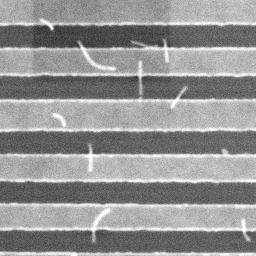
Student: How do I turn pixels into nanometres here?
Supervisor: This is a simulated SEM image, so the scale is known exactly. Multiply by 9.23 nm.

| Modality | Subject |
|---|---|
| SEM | lines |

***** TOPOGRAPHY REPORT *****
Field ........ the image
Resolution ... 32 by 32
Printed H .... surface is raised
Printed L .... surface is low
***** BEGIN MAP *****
HHHHHHHHHHHHHHHHHHHHHHHHHHHHHHHH
HHHHHHHHHHHHHHHHHHHHHHHHHHHHHHHH
HHHHHHHHHHHHHHHHHHHHHHHHHHHHHHHH
LLLLLLLLLLLLLLLLLLLLLLLLLLLLLLLL
LLLLLLLLLLLLLLLLLLLLLLLLLLLLLLLL
LLLLLLLLLLLLLLLLLLLLLLLLLLLLLLLL
HHHHHHHHHHHHHHHHHHHHHHHHHHHHHHHH
HHHHHHHHHHHHHHHHHHHHHHHHHHHHHHHH
HHHHHHHHHHHHHHHHHHHHHHHHHHHHHHHH
LLHHLLLLLLLLLLLLLHLLLLLLLLHLLHLL
LLLLLLLLLLLLLLLLLLLLLLLLLLLLLLLL
LLLLLLLLLLLLLLLLLLLLLLLLLLLLLLLL
LLLLLLLLLLLLLLLLLLLLLLHLLLLLLLLL
HHHHHHHHHHHHHHHHHHHHHHHHHHHHHHHH
HHHHHHHHHHHHHHHHHHHHHHHHHHHHHHHH
HHHHHHHHHHHHHHHHHHHHHHHHHHHHHHHH
LLLLLLLLLLLLLLLLLLLLLLLLLLLLLLLL
LLLLLLLLLLLLLLLLLLLLLLLLLLLLLLLL
LLLLLLLLLLLLLLLLLLLLLLLLLLLLLLLL
HHHHHHHHHHHHHHHHHHHHHHHHHHHHHHHH
HHHHHHHHHHHHHHHHHHHHHHHHHHHHHHHH
HHHHHHHHHHHHHHHHHHHHHHHHHHHHHHHH
HHHHHHHHHHHHHHHHHHHHHHHHHHHHHHHH
LLLLLLLLLLLLLLLLLLLLLLLLLLLLLLLL
LLLLLLLLLLLLLLLLLLLLLLLLLLLLLLLL
LHLLLLLLLLLLLLLLLLLLLLLLLLLLLLLL
HHHHHHHHHHHHHHHHHHHHHHHHHHHHHHHH
HHHHHHHHHHHHHHHHHHHHHHHHHHHHHHHH
HHHHHHHHHHHHHHHHHHHHHHHHHHHHHHHH
LLLLLLLLLLLLLLLLLLLLLLLLLLLLLLLL
LLLLLLLLLLLLLLLLLLLLLLLLLLLLLLLL
LLLLLLLLLLLLLLLLLLLLLLLLLLLLLLLL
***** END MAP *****